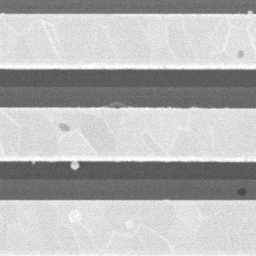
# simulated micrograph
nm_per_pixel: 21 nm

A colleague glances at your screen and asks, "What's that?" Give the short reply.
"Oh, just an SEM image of lines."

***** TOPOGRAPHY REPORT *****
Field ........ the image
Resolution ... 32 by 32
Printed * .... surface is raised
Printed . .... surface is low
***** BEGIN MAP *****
................................
................................
********************************
********************************
********************************
********************************
********************************
********************************
..****.*********.***************
................................
................................
................................
................................
................................
********************************
********************************
********************************
********************************
********************************
********************************
................................
................................
................................
................................
................................
********************************
********************************
********************************
********************************
********************************
********************************
********************************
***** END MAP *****